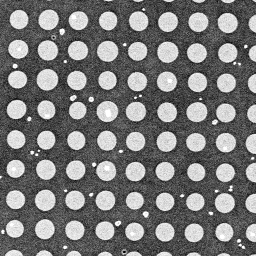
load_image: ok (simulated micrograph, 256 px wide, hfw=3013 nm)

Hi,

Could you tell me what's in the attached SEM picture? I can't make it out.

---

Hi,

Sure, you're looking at an array of small figures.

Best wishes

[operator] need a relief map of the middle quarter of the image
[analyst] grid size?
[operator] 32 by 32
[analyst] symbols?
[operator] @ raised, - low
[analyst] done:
--------------------------------
--------------------------------
-@@@@----@@@-----@@@----@@@-----
-@@@@----@@@@---@@@@---@@@@@---@
-@@@@----@@@@---@@@@@--@@@@@---@
-@@@@----@@@@---@@@@----@@@@---@
-----------------@@------@@-----
--------------------------------
--@-----------------------------
----------@@--------------------
--@@@----@@@@---@@@@----@@@@---@
-@@@@---@@@@@---@@@@----@@@@---@
--@@@---@@@@@---@@@@----@@@@---@
--@@-----@@@@---@@@@----@@@@---@
--------------------------------
--------------------------------
--------------------------------
--@@-----@@@-----@@-----@@@-----
-@@@@----@@@@---@@@@---@@@@@---@
-@@@@----@@@@---@@@@---@@@@@---@
-@@@@----@@@@---@@@@----@@@@---@
-----------------@@-----@@@-----
--------------------------------
--------------------------------
--@@------@---------------------
-@@@@----@@@@---@@@@---@@@@----@
-@@@@---@@@@@---@@@@---@@@@----@
-@@@@---@@@@@---@@@@---@@@@----@
--@@-----@@@----@@@@----@@@-----
--------------------------------
--------------------------------
--------------------------------